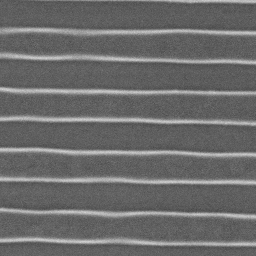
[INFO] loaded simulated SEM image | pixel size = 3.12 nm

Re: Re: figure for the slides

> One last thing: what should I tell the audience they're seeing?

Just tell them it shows wiring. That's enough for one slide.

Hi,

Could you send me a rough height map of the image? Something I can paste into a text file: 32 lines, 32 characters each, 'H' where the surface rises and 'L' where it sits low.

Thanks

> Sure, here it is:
LLLLLLLLLLLLLLLLLLLLLLLLLLLLLLLL
LLLLLLLLLLLLLLLLLLLLLLLLLLLLLLLL
LLLLLLLLLLLLLLLLLLLLLLLLLLLLLLLL
LLLLLLLLLLLLLLLLLLLLLLLLLLLLLLLL
HHHHHHHHHHHHHHHHHHHHHHHHHHHHHHHH
HHHHHHHHHHHHHHHHHHHHHHHHHHHHHHHH
HHHHHHHHHHHHHHHHHHHHHHHHHHHHHHHH
LLLLLLLLLLLLLLLLHHHHHHHHHHHHHHHH
LLLLLLLLLLLLLLLLLLLLLLLLLLLLLLLL
LLLLLLLLLLLLLLLLLLLLLLLLLLLLLLLL
LLLLLLLLLLLLLLLLLLLLLLLLLLLLLLLL
HHHHHHHHHHHHHHHHLLLHHHHHLLLLLLLL
HHHHHHHHHHHHHHHHHHHHHHHHHHHHHHHH
HHHHHHHHHHHHHHHHHHHHHHHHHHHHHHHH
HHHHHHHHHHHHHHHHHHHHHHHHHHHHHHHH
LLLLLLLLLLLLLLLLLLLLLLLLLLLLLLHH
LLLLLLLLLLLLLLLLLLLLLLLLLLLLLLLL
LLLLLLLLLLLLLLLLLLLLLLLLLLLLLLLL
LLLLLLLLLLLLLLLLLLLLLLLLLLLLLLLL
HHHHHHHHHHHHHHHHHHHHHHHHHHHHHHHH
HHHHHHHHHHHHHHHHHHHHHHHHHHHHHHHH
HHHHHHHHHHHHHHHHHHHHHHHHHHHHHHHH
LLHHHHHHHHHHHHHHHHHHHHHHHHHHHHHH
LLLLLLLLLLLLLLLLLLLLLLLLLLLLLLLL
LLLLLLLLLLLLLLLLLLLLLLLLLLLLLLLL
LLLLLLLLLLLLLLLLLLLLLLLLLLLLLLLL
HHHHHHHHHHLLLLLLLLLLLLLLLLLLLLLL
HHHHHHHHHHHHHHHHHHHHHHHHHHHHHHHH
HHHHHHHHHHHHHHHHHHHHHHHHHHHHHHHH
HHHHHHHHHHHHHHHHHHHHHHHHHHHHHHHH
LLLLLLLLLLLLLLLLLLLHHHHHHHHHHHHH
LLLLLLLLLLLLLLLLLLLLLLLLLLLLLLLL